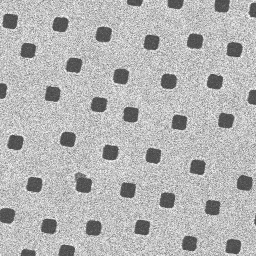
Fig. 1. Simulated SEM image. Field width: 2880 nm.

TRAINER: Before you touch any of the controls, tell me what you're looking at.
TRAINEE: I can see a regular array of holes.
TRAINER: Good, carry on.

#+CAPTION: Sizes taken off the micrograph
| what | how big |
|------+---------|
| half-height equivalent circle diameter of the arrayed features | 181 nm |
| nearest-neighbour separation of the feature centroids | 460 nm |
